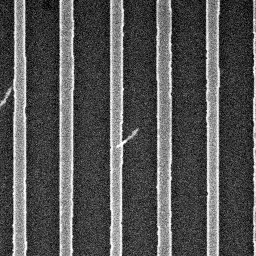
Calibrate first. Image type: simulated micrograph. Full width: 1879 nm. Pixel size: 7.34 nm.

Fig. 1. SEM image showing lines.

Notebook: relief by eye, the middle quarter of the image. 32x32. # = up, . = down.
##..........##.........###......
##..........##.........####.....
##..........##.........###......
##..........##.........###......
##..........##..........###.....
##..........##..........###.....
##..........###.........###.....
##..........##..........##......
##..........##..........###.....
##..........##..........###.....
##..........##..........###.....
##..........##..........###.....
##..........##..........###.....
##..........##..........###.....
##..........##..........###.....
##..........##..........###.....
##..........##..........###.....
##..........##..........###.....
##..........##..........###.....
##..........###.........###.....
##..........##..........###.....
##..........##..........###.....
##..........##..........###.....
##..........##..........###.....
##..........##..........###.....
##..........##..........##......
##..........##..........##......
##..........##..........##......
##..........##..........###.....
##..........##..........##......
##..........##..........##......
##..........##..........##......